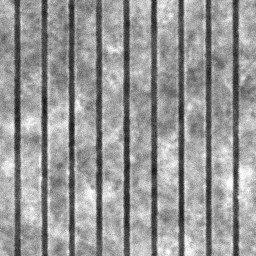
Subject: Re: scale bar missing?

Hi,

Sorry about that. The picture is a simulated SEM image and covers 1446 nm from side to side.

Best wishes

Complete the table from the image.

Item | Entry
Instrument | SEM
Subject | parallel lines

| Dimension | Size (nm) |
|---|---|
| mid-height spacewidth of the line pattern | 37.4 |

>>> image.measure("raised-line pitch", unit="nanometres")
154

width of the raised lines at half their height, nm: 117